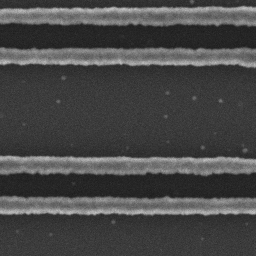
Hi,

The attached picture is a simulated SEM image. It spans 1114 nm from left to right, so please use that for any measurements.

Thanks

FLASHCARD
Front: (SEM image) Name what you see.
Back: lines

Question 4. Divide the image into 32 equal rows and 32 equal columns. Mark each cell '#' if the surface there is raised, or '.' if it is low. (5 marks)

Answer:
................................
################################
################################
................................
................................
................................
################################
################################
................................
................................
................................
................................
................................
................................
................................
................................
................................
................................
................................
................................
################################
###############################.
................................
................................
................................
################################
################################
................................
................................
................................
................................
................................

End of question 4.